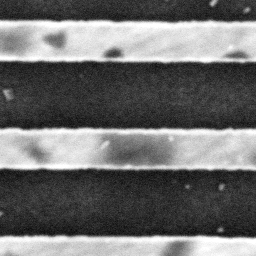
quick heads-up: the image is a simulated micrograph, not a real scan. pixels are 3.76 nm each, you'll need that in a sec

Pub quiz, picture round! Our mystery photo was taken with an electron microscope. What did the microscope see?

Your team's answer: lines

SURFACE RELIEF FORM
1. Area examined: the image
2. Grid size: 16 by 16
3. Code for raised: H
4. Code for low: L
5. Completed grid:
LLLLLLLLLLLLLLLL
HHHHHHHHHHHHHHHH
HHHHHHHHHHHHHHHH
HHHHHHHHHHHHHHHH
LLLLLLLLLLLLLLLL
LLLLLLLLLLLLLLLL
LLLLLLLLLLLLLLLL
LLLLLLLLLLLLLLLL
HHHHHHHHHHHHHHHH
HHHHHHHHHHHHHHHH
LHHHHHHHHHHHHHHH
LLLLLLLLLLLLLLLL
LLLLLLLLLLLLLLLL
LLLLLLLLLLLLLLLL
LLLLLLLLLLLLLLLL
HHHHHHHHHHHHHHHH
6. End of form